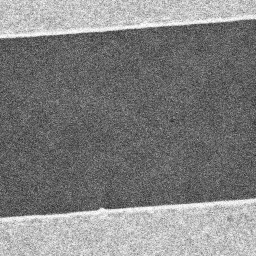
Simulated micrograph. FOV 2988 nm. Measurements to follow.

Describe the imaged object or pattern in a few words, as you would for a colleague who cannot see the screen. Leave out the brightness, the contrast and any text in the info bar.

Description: one or a few lines or trenches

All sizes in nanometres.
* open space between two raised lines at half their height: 2140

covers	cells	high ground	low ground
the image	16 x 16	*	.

****************
**********......
................
................
................
................
................
................
................
................
................
................
................
....************
****************
****************